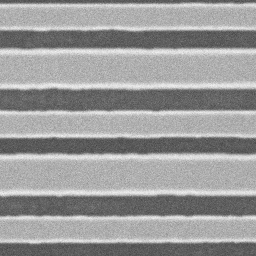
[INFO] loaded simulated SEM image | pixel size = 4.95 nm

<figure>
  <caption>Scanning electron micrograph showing lines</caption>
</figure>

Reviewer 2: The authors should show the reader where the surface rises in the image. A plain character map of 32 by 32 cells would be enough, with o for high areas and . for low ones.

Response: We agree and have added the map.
......................oooooooooo
oooooooooooooooooooooooooooooooo
oooooooooooooooooooooooooooooooo
oooooooooooooooooooooooooooooooo
................................
................................
oooooooooooooooooooooooooooooooo
oooooooooooooooooooooooooooooooo
oooooooooooooooooooooooooooooooo
oooooooooooooooooooooooooooooooo
oooooooooooooooooooooooooooooooo
................................
................................
................................
oooooooooooooooooooooooooooooooo
oooooooooooooooooooooooooooooooo
oooooooooooooooooooooooooooooooo
................................
................................
oooooooooooooooooooooooooooooooo
oooooooooooooooooooooooooooooooo
oooooooooooooooooooooooooooooooo
oooooooooooooooooooooooooooooooo
oooooooooooooooooooooooooooooooo
................................
................................
................................
oooooooooooooooooooooooooooooooo
oooooooooooooooooooooooooooooooo
oooooooooooooooooooooooooooooooo
................................
................................